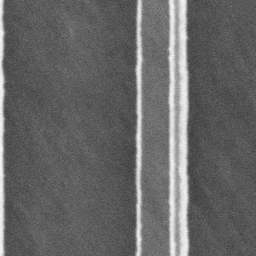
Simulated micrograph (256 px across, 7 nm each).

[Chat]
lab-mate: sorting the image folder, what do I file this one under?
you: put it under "lines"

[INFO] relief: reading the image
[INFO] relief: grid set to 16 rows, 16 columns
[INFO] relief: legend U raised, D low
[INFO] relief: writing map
DDDDDDDDDUUDDDDD
DDDDDDDDDUUDDDDD
DDDDDDDDDUUUDDDD
DDDDDDDDDUUDDDDD
DDDDDDDDDUUUDDDD
DDDDDDDDDUUUDDDD
DDDDDDDDDUUUDDDD
DDDDDDDDDUUUDDDD
DDDDDDDDDUUUDDDD
DDDDDDDDDUUUDDDD
DDDDDDDDDUUUDDDD
DDDDDDDDDUUUDDDD
DDDDDDDDDUUUDDDD
DDDDDDDDDUUUDDDD
DDDDDDDDDUUUDDDD
DDDDDDDDDUUUDDDD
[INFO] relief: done